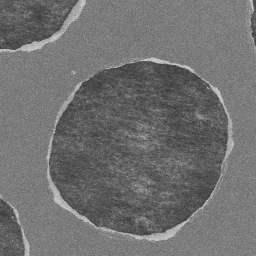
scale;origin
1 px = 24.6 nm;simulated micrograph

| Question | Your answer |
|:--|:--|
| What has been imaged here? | holes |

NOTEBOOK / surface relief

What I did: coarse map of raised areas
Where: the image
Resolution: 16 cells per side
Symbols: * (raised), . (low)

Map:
.....***********
....************
...*************
****************
******......****
*****........***
****..........**
****..........**
***...........**
***...........**
***...........**
***...........**
****.........***
.****.......****
.******...******
..**************